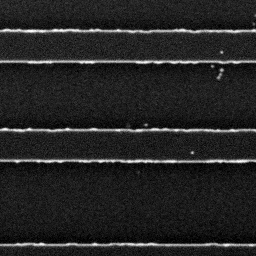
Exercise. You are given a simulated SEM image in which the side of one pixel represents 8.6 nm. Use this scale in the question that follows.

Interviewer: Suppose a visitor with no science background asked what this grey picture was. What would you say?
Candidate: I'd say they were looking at lines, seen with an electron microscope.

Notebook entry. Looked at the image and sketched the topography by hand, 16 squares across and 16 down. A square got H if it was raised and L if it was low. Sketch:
LLLLLLLLLLLLLLLL
LLLLLLLLLLLLLLLL
HHHHHHHHHHHHHHHH
HHHHHHHHHHHHHHHH
LLLLLLLLLLLLLLLL
LLLLLLLLLLLLLLLL
LLLLLLLLLLLLLLLL
LLLLLLLLLLLLLLLL
HHHHHHHHHHHHHHHH
HHHHHHHHHHHHHHHH
LLLLLLLLLLLLLLLL
LLLLLLLLLLLLLLLL
LLLLLLLLLLLLLLLL
LLLLLLLLLLLLLLLL
LLLLLLLLLLLLLLLL
HHHHHHHHHHHHHHHH